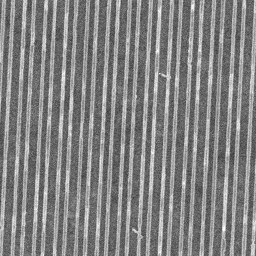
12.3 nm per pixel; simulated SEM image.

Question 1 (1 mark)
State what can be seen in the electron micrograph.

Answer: parallel lines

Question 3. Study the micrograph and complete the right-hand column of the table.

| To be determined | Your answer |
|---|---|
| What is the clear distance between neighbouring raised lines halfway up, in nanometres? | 103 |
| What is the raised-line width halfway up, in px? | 2.87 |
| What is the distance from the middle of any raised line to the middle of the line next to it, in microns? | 0.13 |